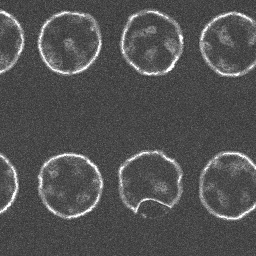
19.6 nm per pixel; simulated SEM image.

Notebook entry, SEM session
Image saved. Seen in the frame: raised bodies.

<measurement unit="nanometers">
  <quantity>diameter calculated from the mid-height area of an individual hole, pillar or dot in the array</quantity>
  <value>1230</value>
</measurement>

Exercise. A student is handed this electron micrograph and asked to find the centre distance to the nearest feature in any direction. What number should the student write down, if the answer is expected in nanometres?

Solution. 1590